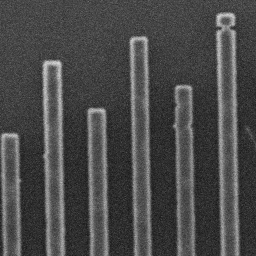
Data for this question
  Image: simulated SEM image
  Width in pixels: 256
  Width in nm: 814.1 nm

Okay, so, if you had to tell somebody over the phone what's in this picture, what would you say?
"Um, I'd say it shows parallel lines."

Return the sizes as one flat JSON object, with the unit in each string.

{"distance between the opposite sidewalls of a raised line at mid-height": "50.5 nanometers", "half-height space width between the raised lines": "89.1 nm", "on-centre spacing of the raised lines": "139 nanometers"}